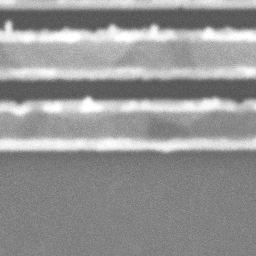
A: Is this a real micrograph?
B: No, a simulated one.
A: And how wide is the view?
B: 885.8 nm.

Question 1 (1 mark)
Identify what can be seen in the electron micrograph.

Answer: one or a few lines or trenches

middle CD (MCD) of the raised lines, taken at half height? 42 px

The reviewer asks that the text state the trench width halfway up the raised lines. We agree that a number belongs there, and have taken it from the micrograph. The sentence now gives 98.5 nm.